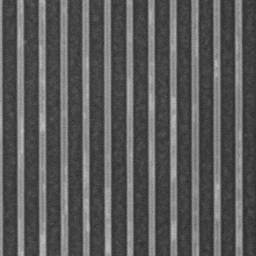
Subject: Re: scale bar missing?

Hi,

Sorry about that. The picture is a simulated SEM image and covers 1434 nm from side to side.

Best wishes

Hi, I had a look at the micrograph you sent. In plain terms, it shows parallel lines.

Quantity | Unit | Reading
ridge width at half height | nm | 31.5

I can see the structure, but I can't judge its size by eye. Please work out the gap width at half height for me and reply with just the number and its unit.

91 nanometers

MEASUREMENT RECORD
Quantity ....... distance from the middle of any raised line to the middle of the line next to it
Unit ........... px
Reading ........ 21.8